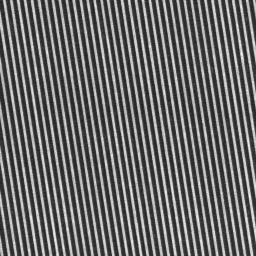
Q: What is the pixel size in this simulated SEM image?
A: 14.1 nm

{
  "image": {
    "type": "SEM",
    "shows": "parallel lines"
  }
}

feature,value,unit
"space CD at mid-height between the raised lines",5.19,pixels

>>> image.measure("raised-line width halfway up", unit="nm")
24.3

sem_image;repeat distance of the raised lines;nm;96.3